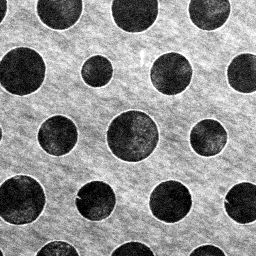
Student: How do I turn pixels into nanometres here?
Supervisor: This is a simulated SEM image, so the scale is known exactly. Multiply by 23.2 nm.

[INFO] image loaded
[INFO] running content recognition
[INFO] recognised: holes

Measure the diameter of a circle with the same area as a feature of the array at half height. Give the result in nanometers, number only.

955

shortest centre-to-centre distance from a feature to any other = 1720 nm